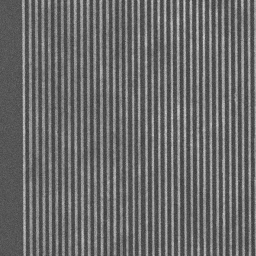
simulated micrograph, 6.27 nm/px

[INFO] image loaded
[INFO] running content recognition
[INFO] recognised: parallel lines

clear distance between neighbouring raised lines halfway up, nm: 25.8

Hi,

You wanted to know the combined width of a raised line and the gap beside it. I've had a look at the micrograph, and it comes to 6.43 pixels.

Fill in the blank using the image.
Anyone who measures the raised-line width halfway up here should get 14.9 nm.